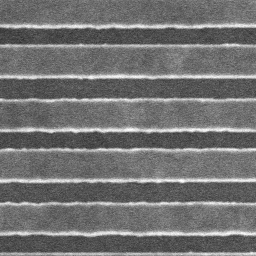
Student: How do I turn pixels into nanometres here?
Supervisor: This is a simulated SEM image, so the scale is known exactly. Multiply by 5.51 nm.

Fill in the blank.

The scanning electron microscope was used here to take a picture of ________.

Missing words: lines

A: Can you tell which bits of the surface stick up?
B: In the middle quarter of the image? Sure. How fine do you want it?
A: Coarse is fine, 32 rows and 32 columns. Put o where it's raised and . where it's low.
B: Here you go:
oooooooooooooooooooooooooooooooo
oooooooooooooooooooooooooooooooo
oooooooooooooooooooooooooooooooo
................................
................................
................................
................................
................................
................................
oooooooooooooooooooooooooooooooo
oooooooooooooooooooooooooooooooo
oooooooooooooooooooooooooooooooo
oooooooooooooooooooooooooooooooo
oooooooooooooooooooooooooooooooo
oooooooooooooooooooooooooooooooo
oooooooooooooooooooooooooooooooo
oooooooooooooooooooooooooooooooo
................................
................................
................................
................................
oooooooooooooooooooooooooooooooo
oooooooooooooooooooooooooooooooo
oooooooooooooooooooooooooooooooo
oooooooooooooooooooooooooooooooo
oooooooooooooooooooooooooooooooo
oooooooooooooooooooooooooooooooo
oooooooooooooooooooooooooooooooo
oooooooooooooooooooooooooooooooo
................................
................................
................................